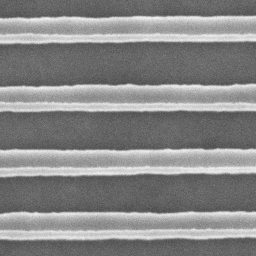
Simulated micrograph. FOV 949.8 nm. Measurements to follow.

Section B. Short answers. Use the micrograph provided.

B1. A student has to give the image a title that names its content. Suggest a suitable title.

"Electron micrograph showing lines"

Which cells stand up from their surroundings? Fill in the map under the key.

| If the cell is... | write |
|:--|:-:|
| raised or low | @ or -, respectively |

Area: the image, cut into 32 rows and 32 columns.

--------------------------------
--------------------------------
@@@@@@@@@@@@@@@@@@@@@@@@@@@@@@@@
@@@@@@@@@@@@@@@@@@@@@@@@@@@@@@@@
@@@@@@@@@@@@@@@@@@@@@@@@@@@@@@@@
--------------------------------
--------------------------------
--------------------------------
--------------------------------
--------------------------------
--------------------------------
@@@@@@@@@@@@@@@@@@@@@@@@@@@@@@@@
@@@@@@@@@@@@@@@@@@@@@@@@@@@@@@@@
@@@@@@@@@@@@@@@@@@@@@@@@@@@@@@@@
--------------------------------
--------------------------------
--------------------------------
--------------------------------
--------------------------------
@@@@@@@@@@@@@@@@@@@@@@@@@@@@@@@@
@@@@@@@@@@@@@@@@@@@@@@@@@@@@@@@@
@@@@@@@@@@@@@@@@@@@@@@@---------
--------------------------------
--------------------------------
--------------------------------
--------------------------------
--------------------------------
@@@@@@@@@@@@@@@@@@@@@@@@@@@@@@@@
@@@@@@@@@@@@@@@@@@@@@@@@@@@@@@@@
@@@@@@@@@@@@@@@@@@@@@@@@@@@@@@@@
--------------------------------
--------------------------------